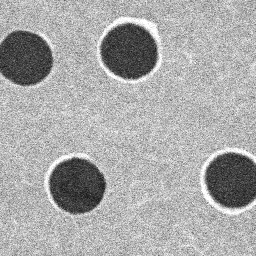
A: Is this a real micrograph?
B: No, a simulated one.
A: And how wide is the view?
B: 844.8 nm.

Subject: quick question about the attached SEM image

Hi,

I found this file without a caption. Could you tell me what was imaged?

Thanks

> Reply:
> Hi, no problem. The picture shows holes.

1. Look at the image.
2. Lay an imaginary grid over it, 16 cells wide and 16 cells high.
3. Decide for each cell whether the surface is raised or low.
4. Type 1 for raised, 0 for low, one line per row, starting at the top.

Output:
1111111111111111
1111111111111111
0001110000111111
0001110000111111
0001111001111111
1111111111111111
1111111111111111
1111111111111111
1111111111111111
1111111111111111
1110001111111000
1110000111111000
1110001111111000
1111111111111111
1111111111111111
1111111111111111